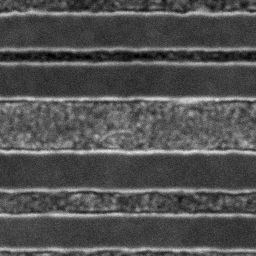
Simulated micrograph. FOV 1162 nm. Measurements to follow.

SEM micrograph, lines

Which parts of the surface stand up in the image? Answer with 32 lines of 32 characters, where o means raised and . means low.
................................
.o.oo...o.....ooo..oo........oo.
oooooooooooooooooooooooooooooooo
oooooooooooooooooooooooooooooooo
oooooooooooooooooooooooooooooooo
oooooooooooooooooooooooooooooooo
................................
................................
oooooooooooooooooooooooooooooooo
oooooooooooooooooooooooooooooooo
oooooooooooooooooooooooooooooooo
oooooooooooooooooooooooooooooooo
o.....oo..o................o...o
................................
................................
................................
................................
................................
................................
oooooooooooooooooooooooooooooooo
oooooooooooooooooooooooooooooooo
oooooooooooooooooooooooooooooooo
oooooooooooooooooooooooooooooooo
oooooooooooooooooooooooooooooooo
................................
................................
................................
oooooooooooooooooooooooooooooooo
oooooooooooooooooooooooooooooooo
oooooooooooooooooooooooooooooooo
oooooooooooooooooooooooooooooooo
................................